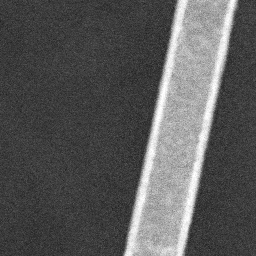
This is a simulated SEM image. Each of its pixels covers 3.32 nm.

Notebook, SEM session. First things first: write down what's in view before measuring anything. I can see one or a few lines or trenches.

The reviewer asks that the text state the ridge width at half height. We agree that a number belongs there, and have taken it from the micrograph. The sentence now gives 165 nanometres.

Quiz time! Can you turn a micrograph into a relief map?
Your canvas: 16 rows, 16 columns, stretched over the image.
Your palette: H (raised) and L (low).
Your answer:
LLLLLLLLLLLHHHLL
LLLLLLLLLLLHHHLL
LLLLLLLLLLLHHHLL
LLLLLLLLLLLHHHLL
LLLLLLLLLLHHHHLL
LLLLLLLLLLHHHLLL
LLLLLLLLLLHHHLLL
LLLLLLLLLLHHHLLL
LLLLLLLLLLHHHLLL
LLLLLLLLLHHHHLLL
LLLLLLLLLHHHLLLL
LLLLLLLLLHHHLLLL
LLLLLLLLLHHHLLLL
LLLLLLLLHHHHLLLL
LLLLLLLLHHHHLLLL
LLLLLLLLHHHLLLLL